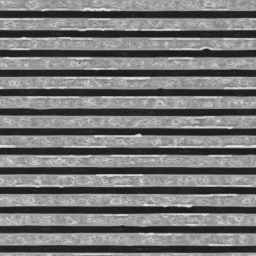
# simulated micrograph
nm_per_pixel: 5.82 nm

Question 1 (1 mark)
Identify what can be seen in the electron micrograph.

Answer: parallel lines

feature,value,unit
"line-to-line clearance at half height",41.5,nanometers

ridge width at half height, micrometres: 0.072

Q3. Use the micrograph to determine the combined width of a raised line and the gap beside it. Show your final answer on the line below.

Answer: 0.114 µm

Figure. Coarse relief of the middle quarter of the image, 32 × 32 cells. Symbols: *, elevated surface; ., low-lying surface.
********************************
.......**.......................
................................
********************************
********************************
********************************
................................
................................
********************************
********************************
********************************
................................
................................
********************************
********************************
********************************
................................
................................
********************************
********************************
********************************
................................
................................
********************************
********************************
********************************
................................
...................*............
********************************
********************************
********************************
................................